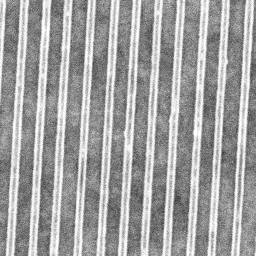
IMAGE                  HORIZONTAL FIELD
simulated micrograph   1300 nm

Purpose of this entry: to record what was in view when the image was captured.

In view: parallel lines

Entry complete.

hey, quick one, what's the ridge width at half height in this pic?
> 34.2 nanometers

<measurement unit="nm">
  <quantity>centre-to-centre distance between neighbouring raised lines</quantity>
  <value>114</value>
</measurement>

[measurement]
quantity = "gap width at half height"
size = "0.083 µm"